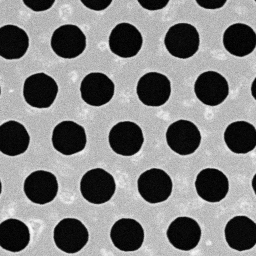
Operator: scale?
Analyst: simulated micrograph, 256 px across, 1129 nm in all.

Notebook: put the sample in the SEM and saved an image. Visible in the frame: a regular array of holes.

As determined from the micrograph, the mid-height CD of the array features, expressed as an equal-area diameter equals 152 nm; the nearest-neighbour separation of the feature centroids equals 245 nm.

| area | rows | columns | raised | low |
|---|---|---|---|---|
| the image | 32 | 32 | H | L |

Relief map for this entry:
HHHLLLLHHHLLLLHHHLLLLHHHHLLLHHHH
HHHHHHHHHHHHHHHHHHHHHHHHHHHHHHHH
HHHHHHHHHHHHHHHHHHHHHHHHHHHHHHHH
LLHHHHHLLLHHHHLLLHHHHLLLHHHHLLLH
LLLHHHHLLLLHHHLLLLHHHLLLLHHHLLLL
LLLLHHLLLLLHHHLLLLHHHLLLLHHHLLLL
LLLHHHHLLLHHHHLLLHHHHLLLHHHHHLLH
HHHHHHHHHHHHHHHHHHHHHHHHHHHHHHHH
HHHHHHHHHHHHHHHHHHHHHHHHHHHHHHHH
HHHHLLHHHHHLLHHHHHLLLHHHHLLLHHHH
HHHLLLLHHHLLLLHHHLLLLHHHLLLLHHHL
HHHLLLLHHHLLLLHHHLLLLHHHLLLLLHHL
HHHLLLLHHHLLLLHHHHLLLHHHHLLLHHHH
HHHHHHHHHHHHHHHHHHHHHHHHHHHHHHHH
HHHHHHHHHHHHHHHHHHHHHHHHHHHHHHHH
LLLHHHHLLLHHHHHLLHHHHHLLHHHHHLLH
LLLHHHHLLLLHHHLLLLHHHLLLLHHHLLLL
LLLLHHHLLLLHHHLLLLHHHLLLLHHHLLLL
LLLHHHHLLLHHHHLLLLHHHLLLLHHHHLLL
HHHHHHHHHHHHHHHHHHHHHHHHHHHHHHHH
HHHHHHHHHHHHHHHHHHHHHHHHHHHHHHHH
HHHHLLHHHHHLLHHHHHLLLHHHHLLLHHHH
HHHLLLLHHHLLLLHHHLLLLHHHHLLLHHHH
HHHLLLLHHHLLLLHHHLLLLHHHLLLLLHHH
HHHLLLLHHHLLLLHHHHLLLHHHHLLLHHHH
HHHHHLHHHHHHHHHHHHHHHHHHHHHHHHHH
HHHHHHHHHHHHHHHHHHHHHHHHHHHHHHHH
HLHHHHHHLLHHHHHLLHHHHHLLHHHHHLLH
LLLHHHHLLLLHHHLLLLHHHLLLLHHHLLLL
LLLLHHHLLLLHHHLLLLHHHLLLLHHHLLLL
LLLHHHHLLLLHHHLLLLHHHHLLLHHHHLLL
HHHHHHHHLHHHHHHHHHHHHHHHHHHHHHHH